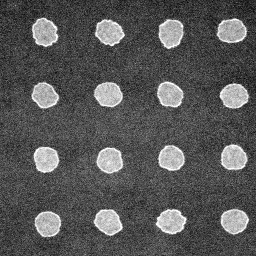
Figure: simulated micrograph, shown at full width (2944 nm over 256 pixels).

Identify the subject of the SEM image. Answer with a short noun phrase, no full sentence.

a regular array of raised bodies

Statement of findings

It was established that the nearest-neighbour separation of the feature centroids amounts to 709 nm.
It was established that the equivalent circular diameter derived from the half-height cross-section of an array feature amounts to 287 nm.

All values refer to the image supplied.